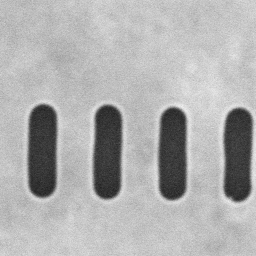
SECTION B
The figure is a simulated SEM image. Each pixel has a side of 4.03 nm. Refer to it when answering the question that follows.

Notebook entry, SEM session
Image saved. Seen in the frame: groups of lines, slits or small figures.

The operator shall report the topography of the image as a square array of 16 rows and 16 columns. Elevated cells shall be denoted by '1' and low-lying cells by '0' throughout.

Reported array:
1111111111111111
1111111111111111
1111111111111111
1111111111111111
1111111111111111
1111111111111111
1111111111111111
1100110011001100
1100110011001100
1100110011001100
1100110011001100
1100110011001100
1111111111111101
1111111111111111
1111111111111111
1111111111111111